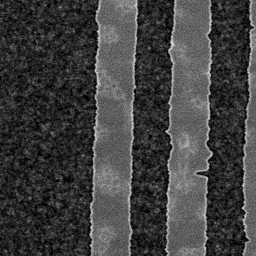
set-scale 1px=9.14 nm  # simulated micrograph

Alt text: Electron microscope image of one or a few lines or trenches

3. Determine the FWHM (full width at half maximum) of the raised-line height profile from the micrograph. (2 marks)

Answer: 351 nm